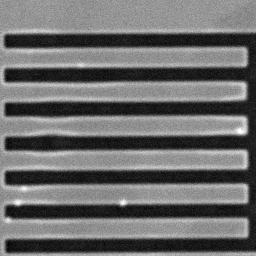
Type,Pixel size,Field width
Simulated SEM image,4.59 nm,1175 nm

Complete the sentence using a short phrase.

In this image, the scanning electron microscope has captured groups of lines, slits or small figures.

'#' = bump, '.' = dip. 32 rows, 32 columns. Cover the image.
################################
################################
################################
################################
#...............................
................................
###############################.
###############################.
#...............................
................................
#.............################..
###############################.
######.......###############....
................................
#...............................
###############################.
###############################.
#...............................
#...............................
###############################.
###############################.
#...............................
................................
###############################.
###############################.
#.#............#................
................................
##............#################.
###############################.
###############################.
#...............................
#...............................